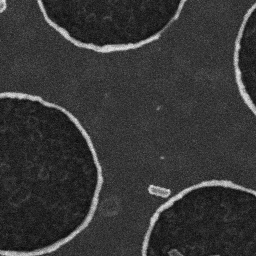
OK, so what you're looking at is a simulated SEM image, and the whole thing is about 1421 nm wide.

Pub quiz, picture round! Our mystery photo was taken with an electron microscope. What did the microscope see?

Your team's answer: holes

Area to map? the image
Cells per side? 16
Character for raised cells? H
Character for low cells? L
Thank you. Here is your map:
HHHLLLLLLLLHHHHH
HHHLLLLLLLHHHHHL
HHHHHLLLLHHHHHHL
HHHHHHHHHHHHHHHL
HHHHHHHHHHHHHHHL
HHHHHHHHHHHHHHHL
LLLHHHHHHHHHHHHH
LLLLHHHHHHHHHHHH
LLLLLHHHHHHHHHHH
LLLLLLHHHHHHHHHH
LLLLLLHHHHHHHHHH
LLLLLLHHHHHHHHHH
LLLLLLHHHHHLLLLL
LLLLLHHHHHLLLLLL
LLLLLHHHHLLLLLLL
LLLHHHHHHLLLLLLL